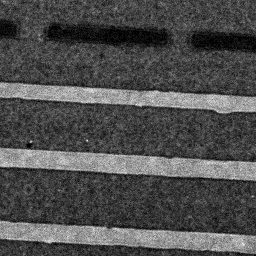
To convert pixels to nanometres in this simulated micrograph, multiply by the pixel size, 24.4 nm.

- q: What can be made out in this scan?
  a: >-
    one or a few lines or trenches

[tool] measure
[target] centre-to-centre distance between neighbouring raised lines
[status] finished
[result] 1650 nm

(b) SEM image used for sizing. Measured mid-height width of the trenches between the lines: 1260 nm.